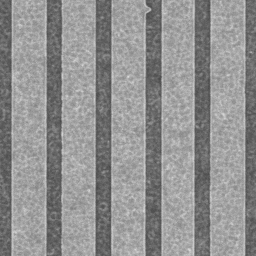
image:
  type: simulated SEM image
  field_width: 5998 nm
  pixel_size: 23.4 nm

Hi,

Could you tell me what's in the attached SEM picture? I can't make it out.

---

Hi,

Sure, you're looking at parallel lines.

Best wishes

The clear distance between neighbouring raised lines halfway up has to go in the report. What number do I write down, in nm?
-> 392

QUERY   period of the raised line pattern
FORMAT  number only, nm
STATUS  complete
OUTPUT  1160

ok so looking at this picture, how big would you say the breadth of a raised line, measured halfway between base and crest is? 779 nm